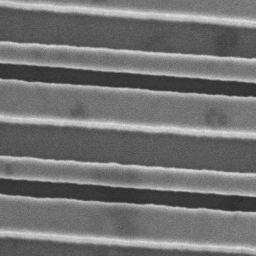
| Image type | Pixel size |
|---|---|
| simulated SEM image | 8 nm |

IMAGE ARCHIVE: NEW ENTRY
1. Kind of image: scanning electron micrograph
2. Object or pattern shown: lines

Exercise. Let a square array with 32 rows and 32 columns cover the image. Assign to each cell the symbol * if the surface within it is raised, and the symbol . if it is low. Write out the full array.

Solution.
..******************************
...............*****************
............................****
................................
................................
***.............................
******************..............
********************************
........************************
.....................***********
*******.........................
**********************..........
********************************
********************************
********************************
............********************
..........................******
................................
................................
................................
***************.................
****************************....
....****************************
..................**************
*.............................**
****************................
*******************************.
********************************
********************************
.....***************************
...................*************
................................